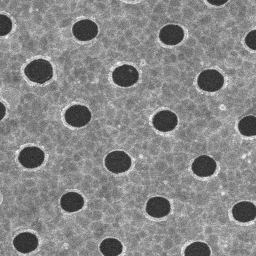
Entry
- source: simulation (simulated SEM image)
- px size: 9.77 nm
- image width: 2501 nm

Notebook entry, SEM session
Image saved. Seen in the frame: a regular array of holes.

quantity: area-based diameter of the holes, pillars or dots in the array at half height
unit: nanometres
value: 241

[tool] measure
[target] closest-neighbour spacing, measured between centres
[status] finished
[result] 588 nm